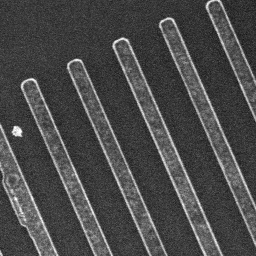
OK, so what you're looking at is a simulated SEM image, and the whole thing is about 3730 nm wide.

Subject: parallel lines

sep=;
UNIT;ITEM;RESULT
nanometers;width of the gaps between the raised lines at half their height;505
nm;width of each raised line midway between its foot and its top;225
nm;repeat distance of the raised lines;733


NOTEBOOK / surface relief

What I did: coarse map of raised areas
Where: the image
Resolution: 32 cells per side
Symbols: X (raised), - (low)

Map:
--------------------------XX----
--------------------------XX----
--------------------------XXX---
--------------------XX-----XX---
--------------------XXX----XX---
--------------XX-----XX-----XX--
--------------XXX----XX-----XX--
---------------XX-----XX-----XX-
---------XX----XX-----XX-----XX-
---------XX-----XX-----XX-----XX
---XX----XX-----XX-----XX-----XX
---XX-----XX-----XX-----XX----XX
---XX-----XX-----XX-----XX-----X
----XX-----XX----XXX----XXX----X
----XX-----XX-----XX-----XX-----
-----XX-----XX----XXX----XX-----
-----XX-----XX-----XX-----XX----
X-----XX----XX-----XX-----XX----
X-----XX-----XX-----XX-----XX---
XX----XXX----XX-----XX-----XX---
XX-----XX-----XX-----XX----XXX--
XXX----XX-----XX-----XX-----XX--
XXX-----XX-----XX----XXX----XX--
-XX-----XX-----XX-----XX-----XX-
-XXX-----XX----XXX----XXX----XX-
--XX-----XX-----XX-----XX-----XX
--XXX-----XX----XX-----XX-----XX
--XXX-----XX-----XX-----XX-----X
---XXX----XX-----XX-----XX-----X
----XX-----XX-----XX----XXX----X
----XXX----XX-----XX-----XX-----
-----XX-----XX-----XX----XXX----